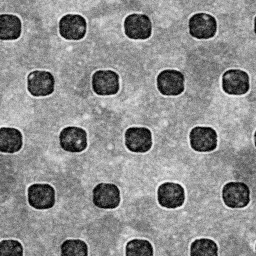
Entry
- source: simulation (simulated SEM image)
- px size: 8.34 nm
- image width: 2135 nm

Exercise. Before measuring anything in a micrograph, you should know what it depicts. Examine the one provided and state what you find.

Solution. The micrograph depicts a regular array of holes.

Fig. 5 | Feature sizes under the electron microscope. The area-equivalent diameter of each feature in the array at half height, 241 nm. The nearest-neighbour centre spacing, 0.54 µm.